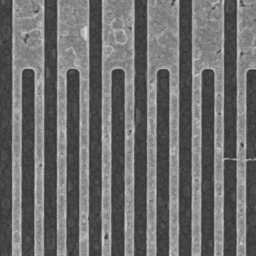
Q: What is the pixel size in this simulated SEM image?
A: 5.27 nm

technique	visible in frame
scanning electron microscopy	parallel lines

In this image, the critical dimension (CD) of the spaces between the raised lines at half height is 71.8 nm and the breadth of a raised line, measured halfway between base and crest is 48.1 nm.